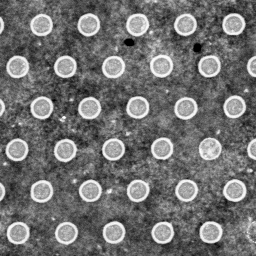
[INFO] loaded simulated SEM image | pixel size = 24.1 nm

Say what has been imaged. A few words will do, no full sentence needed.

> a regular array of raised bodies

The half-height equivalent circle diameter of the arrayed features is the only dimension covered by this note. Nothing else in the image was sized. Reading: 0.491 micrometres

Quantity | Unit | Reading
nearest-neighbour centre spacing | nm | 1140